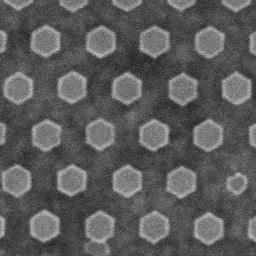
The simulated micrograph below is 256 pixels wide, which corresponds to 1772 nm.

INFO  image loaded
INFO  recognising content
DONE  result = a regular array of raised bodies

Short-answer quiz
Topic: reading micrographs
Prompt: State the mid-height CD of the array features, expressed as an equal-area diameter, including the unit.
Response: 198 nanometers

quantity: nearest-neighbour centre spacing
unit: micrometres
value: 0.367